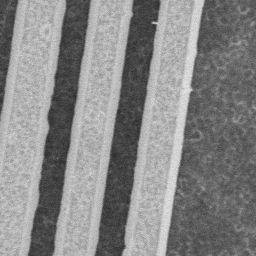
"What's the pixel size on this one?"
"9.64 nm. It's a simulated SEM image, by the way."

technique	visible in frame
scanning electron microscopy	one or a few lines or trenches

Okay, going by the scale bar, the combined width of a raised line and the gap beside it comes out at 665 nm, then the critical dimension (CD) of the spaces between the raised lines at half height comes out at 339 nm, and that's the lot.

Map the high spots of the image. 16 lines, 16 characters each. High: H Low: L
LHHHLLHHLLHHLLLL
LHHHLLHHLLHHLLLL
LHHLLLHHLLHHLLLL
LHHLLHHHLLHHLLLL
LHHLLHHLLLHHLLLL
LHHLLHHLLHHHLLLL
HHHLLHHLLHHLLLLL
HHHLLHHLLHHLLLLL
HHHLLHHLLHHLLLLL
HHHLLHHLLHHLLLLL
HHLLHHLLLHHLLLLL
HHLLHHLLLHHLLLLL
HHLLHHLLHHHLLLLL
HHLLHHLLHHLLLLLL
HHLLHHLLHHLLLLLL
HHLLHHLLHHLLLLLL